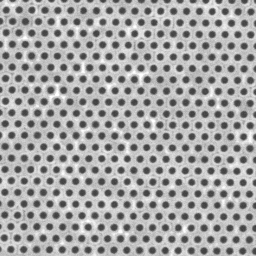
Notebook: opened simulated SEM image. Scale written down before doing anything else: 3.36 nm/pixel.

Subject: a regular array of holes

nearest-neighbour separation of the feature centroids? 0.0425 micrometres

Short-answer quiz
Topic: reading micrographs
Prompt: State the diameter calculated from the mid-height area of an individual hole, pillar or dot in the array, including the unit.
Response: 0.024 micrometres